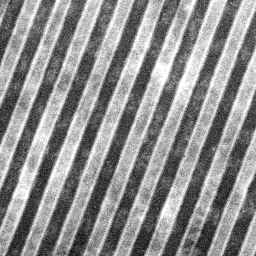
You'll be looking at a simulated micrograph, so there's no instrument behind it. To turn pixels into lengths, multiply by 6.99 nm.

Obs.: parallel lines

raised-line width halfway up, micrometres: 0.0897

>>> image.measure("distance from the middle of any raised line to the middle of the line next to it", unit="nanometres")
203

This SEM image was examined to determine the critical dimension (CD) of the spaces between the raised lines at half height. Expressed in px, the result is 16.2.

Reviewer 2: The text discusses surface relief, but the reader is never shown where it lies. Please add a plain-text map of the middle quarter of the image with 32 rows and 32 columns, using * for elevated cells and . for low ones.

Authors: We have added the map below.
***.....***....****....***.....*
***....****....***.....***.....*
**.....***.....***....****....**
**....****....****....***.....**
**....****....***....****....***
*.....***.....***....***.....***
*....****....****....***.....***
*....***.....***....****....****
.....***....****....***.....***.
....****....***.....***.....***.
....***....****....****....***..
...****....****....***.....***..
...***.....***....****....****..
...***....****....****....***...
..****....***.....***....****...
..***....****....****....***....
.****....***.....***.....***....
.****....***....****....****....
.***....****....****....***.....
****....****....***.....***.....
***.....***....****....****....*
***....****....****....***.....*
***....***.....***....****....**
**....****....****....***.....**
**....****....***.....***.....**
*.....***....****....****....***
*....****....****....***.....***
*....***.....***....****....****
.....***....****....****....***.
....****....****....***.....***.
....***....****....****....****.
....***....****....****....***..